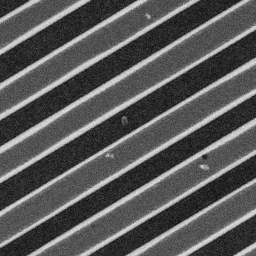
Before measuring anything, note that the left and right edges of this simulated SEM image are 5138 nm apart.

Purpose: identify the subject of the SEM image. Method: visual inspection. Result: lines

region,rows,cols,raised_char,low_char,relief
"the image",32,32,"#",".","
...#######.......#######......##
..######.......#######......####
#######.......######.......#####
#####.......#######......#######
####......#######......#######..
##.......######.......#######...
.......#######......#######.....
.....#######......#######.......
....######.......#######......##
..#######......#######......####
#######.......######.......#####
#####.......#######......#######
####......#######......#######..
##......#######.......#######...
.......######.......#######.....
.....#######......#######......#
....######.......#######......##
..#######......#######......####
#######......#######......######
#####.......#######.....#######.
####......#######......#######..
##......#######......#######....
.......#######.....#######......
.....#######......#######.....##
...#######......#######.....####
..#######......######......#####
#######......#######.....#######
######.....#######......######..
####.....#######......#######...
##......#######.....#######.....
#.....#######......######.......
.....######......#######......##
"